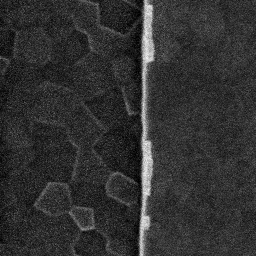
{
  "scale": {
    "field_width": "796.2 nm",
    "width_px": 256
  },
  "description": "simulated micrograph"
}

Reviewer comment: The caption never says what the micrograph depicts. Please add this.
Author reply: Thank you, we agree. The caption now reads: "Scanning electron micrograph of one or a few lines or trenches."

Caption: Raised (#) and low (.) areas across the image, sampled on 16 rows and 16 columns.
.........#######
.........#######
.........#######
.........#######
.........#######
.........#######
.........#######
.........#######
.........#######
.........#######
.........#######
.........#######
.........#######
.........#######
.........#######
.........#######